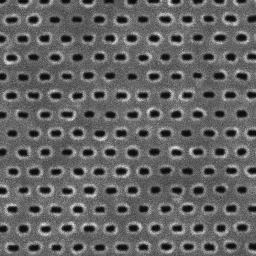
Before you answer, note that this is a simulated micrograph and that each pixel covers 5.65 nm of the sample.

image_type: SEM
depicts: a regular array of holes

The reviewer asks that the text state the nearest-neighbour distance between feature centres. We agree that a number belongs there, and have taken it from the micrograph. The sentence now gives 120 nm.